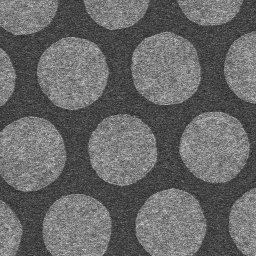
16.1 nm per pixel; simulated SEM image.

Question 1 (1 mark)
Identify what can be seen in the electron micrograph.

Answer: raised bodies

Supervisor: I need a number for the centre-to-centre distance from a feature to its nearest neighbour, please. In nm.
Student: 1470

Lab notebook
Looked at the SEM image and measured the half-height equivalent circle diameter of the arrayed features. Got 1130 nanometers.